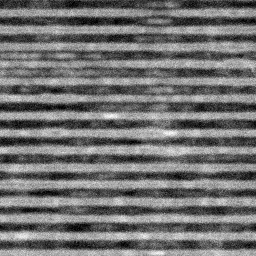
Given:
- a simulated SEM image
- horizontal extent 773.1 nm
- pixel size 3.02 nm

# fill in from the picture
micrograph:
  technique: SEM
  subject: parallel lines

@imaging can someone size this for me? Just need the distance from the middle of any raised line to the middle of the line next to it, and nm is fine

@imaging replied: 51.7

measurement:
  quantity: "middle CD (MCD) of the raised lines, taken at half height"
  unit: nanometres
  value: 19.2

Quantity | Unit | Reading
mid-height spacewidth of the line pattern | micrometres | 0.0328